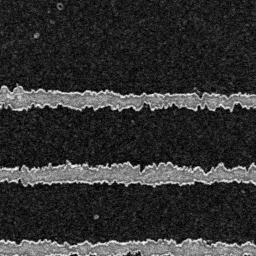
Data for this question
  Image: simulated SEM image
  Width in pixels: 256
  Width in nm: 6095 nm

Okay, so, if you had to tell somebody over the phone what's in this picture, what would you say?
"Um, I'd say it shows one or a few lines or trenches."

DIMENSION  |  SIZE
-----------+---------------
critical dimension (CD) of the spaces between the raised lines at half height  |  60.4 pixels